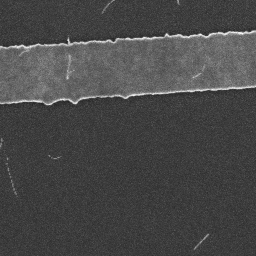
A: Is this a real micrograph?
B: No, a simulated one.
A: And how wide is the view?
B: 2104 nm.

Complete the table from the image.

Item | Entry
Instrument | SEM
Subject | one or a few lines or trenches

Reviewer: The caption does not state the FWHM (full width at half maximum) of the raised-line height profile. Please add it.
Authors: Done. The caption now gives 460 nanometers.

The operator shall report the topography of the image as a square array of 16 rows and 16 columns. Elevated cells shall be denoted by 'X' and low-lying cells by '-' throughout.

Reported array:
----------------
----------------
-------XXXXXXXXX
XXXXXXXXXXXXXXXX
XXXXXXXXXXXXXXXX
XXXXXXXXXXXXXXX-
----------------
----------------
----------------
----------------
----------------
----------------
----------------
----------------
----------------
----------------